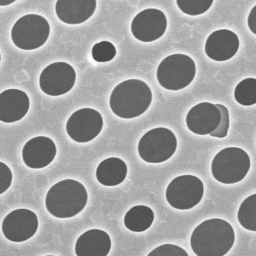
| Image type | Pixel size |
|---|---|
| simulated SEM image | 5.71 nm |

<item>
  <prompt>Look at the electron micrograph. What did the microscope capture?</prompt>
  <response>a regular array of holes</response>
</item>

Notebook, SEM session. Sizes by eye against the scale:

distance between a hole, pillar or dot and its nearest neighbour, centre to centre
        303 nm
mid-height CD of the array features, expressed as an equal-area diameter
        199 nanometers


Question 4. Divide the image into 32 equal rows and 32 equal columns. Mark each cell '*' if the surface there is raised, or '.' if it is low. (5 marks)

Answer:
.******.....**********....******
*******.....******..***...*****.
**....**...******....**********.
**....**********.....**********.
*.....***********...******....**
**...*******..************....**
************..************....**
************..******....***.****
******...***********....********
*****....***********....********
*****....******...**....******..
...***..******.....**********...
....**********.....***********..
....**********....******...*****
...******....**..******.....****
********.....**********....*****
********....******...***..******
****..***..*******....**********
***....**********.....******..**
***....***********...******....*
.**...******....**********.....*
.***********....***********....*
.*******.***...*******...**...**
.*****.....**********....*******
******.....**********....******.
******.....**********....*****..
*...**....******...***********..
*....***********...*******..**..
.....***********..*******....**.
*...******....**********.....***
*********.....**********.....***
*********.....*****....*....****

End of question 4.